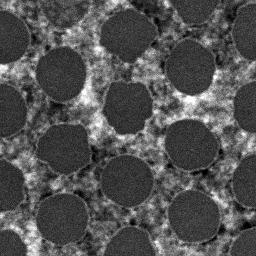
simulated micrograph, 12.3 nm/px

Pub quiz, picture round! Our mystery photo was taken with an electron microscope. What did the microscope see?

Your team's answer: a regular array of raised bodies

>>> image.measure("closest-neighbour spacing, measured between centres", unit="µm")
0.874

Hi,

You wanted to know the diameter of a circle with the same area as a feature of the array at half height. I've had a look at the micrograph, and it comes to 664 nanometers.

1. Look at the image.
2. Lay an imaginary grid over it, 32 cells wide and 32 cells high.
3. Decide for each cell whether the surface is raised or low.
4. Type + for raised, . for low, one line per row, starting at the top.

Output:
.....................++++++....+
++............+++.....+++++...++
+++..........++++++....+++...+++
+++..........+++++++.........+++
++++........++++++++.........+++
++++........+++++++...+++....+++
+++...++++...+++++...+++++....++
++...++++++....++....++++++....+
....+++++++..........++++++.....
....+++++++..........++++++.....
+....++++++...++++...+++++.....+
++...+++++...++++++...++++...+++
+++....++....++++++..........+++
++++.........++++++..........+++
+++..........++++++..........+++
+++....++....+++++...+++++....++
++....+++++...++++...++++++....+
.....++++++..........++++++.....
.....++++++..........++++++.....
....+++++++....++....++++++....+
++....+++++..+++++....++++....++
+++....+++...++++++..........+++
+++..........++++++..........+++
+++..........++++++..........+++
+++...++++...++++++...++++...+++
+++..++++++...++++...++++++...++
+....++++++..........+++++++....
....+++++++..........+++++++....
.....++++++....++....++++++....+
++...+++++....+++++...+++++...++
+++....++....++++++..........+++
+++..........+++++++.........+++